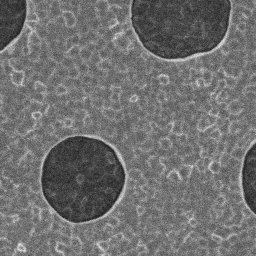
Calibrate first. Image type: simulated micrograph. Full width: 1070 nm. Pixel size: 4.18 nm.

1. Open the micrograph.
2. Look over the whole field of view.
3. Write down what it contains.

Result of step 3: holes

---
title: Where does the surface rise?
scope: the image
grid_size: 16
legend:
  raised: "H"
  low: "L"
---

LLHHHHHHLLLLLLHH
LHHHHHHHLLLLLLHH
LHHHHHHHHLLLLLHH
HHHHHHHHHHLLHHHH
HHHHHHHHHHHHHHHH
HHHHHHHHHHHHHHHH
HHHHHHHHHHHHHHHH
HHHHHHHHHHHHHHHH
HHHHHHHHHHHHHHHH
HHHLLLLHHHHHHHHL
HHHLLLLLHHHHHHHL
HHHLLLLLHHHHHHHL
HHHLLLLHHHHHHHHL
HHHHLLHHHHHHHHHH
HHHHHHHHHHHHHHHH
HHHHHHHHHHHHHHHH